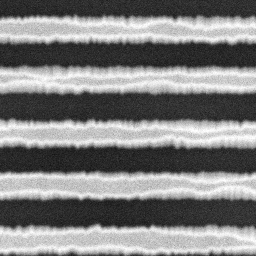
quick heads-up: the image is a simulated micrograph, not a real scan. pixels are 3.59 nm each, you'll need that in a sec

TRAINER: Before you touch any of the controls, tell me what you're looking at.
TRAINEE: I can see lines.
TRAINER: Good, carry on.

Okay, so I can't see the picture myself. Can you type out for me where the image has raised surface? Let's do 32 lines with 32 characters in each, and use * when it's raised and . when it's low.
................................
................................
**********.*.**....**.*.........
********************************
********************************
................................
................................
................................
................................
********************************
********************************
................................
................................
................................
................................
.****.****.*****...*...........*
********************************
********************************
................................
................................
................................
................................
********************************
********************************
**...*..***********......*......
................................
................................
................................
...........**...................
********************************
********************************
*.***............*********......